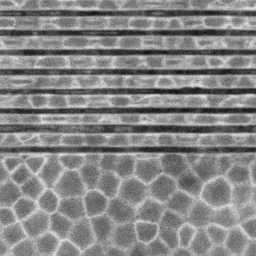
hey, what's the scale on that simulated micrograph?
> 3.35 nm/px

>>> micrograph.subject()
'parallel lines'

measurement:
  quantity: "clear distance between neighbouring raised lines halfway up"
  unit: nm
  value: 21.8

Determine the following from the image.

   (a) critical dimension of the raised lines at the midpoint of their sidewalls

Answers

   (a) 43.2 nanometers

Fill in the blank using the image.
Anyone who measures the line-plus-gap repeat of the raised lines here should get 65.6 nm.